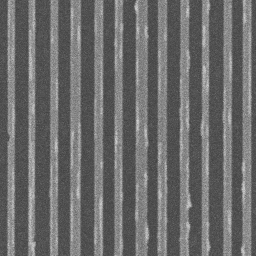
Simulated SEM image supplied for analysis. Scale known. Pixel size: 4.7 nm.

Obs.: parallel lines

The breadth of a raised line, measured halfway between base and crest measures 39.3 nm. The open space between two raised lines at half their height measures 0.061 micrometres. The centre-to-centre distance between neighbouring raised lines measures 21.4 px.